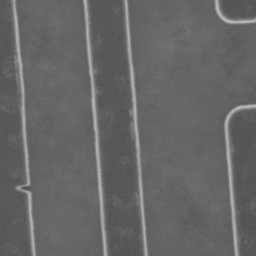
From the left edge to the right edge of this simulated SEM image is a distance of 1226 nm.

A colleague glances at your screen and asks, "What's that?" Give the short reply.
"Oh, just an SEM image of one or a few lines or trenches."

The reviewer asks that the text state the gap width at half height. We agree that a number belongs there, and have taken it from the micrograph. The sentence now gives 338 nanometers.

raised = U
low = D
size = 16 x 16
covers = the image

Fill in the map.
UDDDDUUUDDDDDDUU
UDDDDUUUDDDDDDDD
UDDDDUUUDDDDDDDD
UDDDDDUUDDDDDDDD
UDDDDDUUDDDDDDDD
UDDDDDUUDDDDDDDD
UDDDDDUUDDDDDDDD
UUDDDDUUUDDDDDUU
UUDDDDUUUDDDDDUU
UUDDDDUUUDDDDDUU
UUDDDDUUUDDDDDUU
UUDDDDUUUDDDDDUU
UUDDDDUUUDDDDDDU
UUDDDDUUUDDDDDDU
UUDDDDUUUDDDDDDU
UUDDDDDUUDDDDDDU